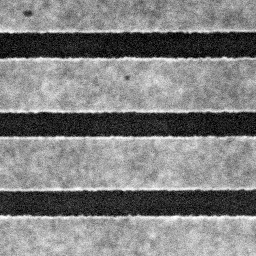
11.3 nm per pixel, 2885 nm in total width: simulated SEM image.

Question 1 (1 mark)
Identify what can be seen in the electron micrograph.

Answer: lines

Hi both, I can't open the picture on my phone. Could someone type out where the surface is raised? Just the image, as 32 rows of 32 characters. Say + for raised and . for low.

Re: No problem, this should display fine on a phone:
++++++++++++++++++++++++++++++++
++++++++++++++++++++++++++++++++
++++++++++++++++++++++++++++++++
++++++++++++++++++++++++++++++++
................................
................................
................................
++++++++++++++++++++++++++++++++
++++++++++++++++++++++++++++++++
++++++++++++++++++++++++++++++++
++++++++++++++++++++++++++++++++
++++++++++++++++++++++++++++++++
++++++++++++++++++++++++++++++++
++++++++++++++++++++++++++++++++
................................
................................
................................
++++++++++++++++++++++++++++++++
++++++++++++++++++++++++++++++++
++++++++++++++++++++++++++++++++
++++++++++++++++++++++++++++++++
++++++++++++++++++++++++++++++++
++++++++++++++++++++++++++++++++
++++++++++++++++++++++++++++++++
................................
................................
................................
++++++++++++++++++++++++++++++++
++++++++++++++++++++++++++++++++
++++++++++++++++++++++++++++++++
++++++++++++++++++++++++++++++++
++++++++++++++++++++++++++++++++